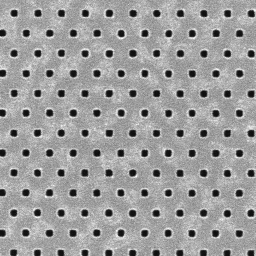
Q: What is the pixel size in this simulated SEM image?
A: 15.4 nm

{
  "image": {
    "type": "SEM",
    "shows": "a regular array of holes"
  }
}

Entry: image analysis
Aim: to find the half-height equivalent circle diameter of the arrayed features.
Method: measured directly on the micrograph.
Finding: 122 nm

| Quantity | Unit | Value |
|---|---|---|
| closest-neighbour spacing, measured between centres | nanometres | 355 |